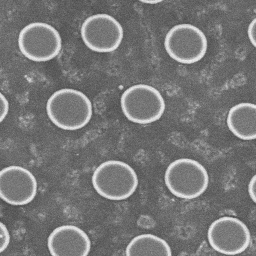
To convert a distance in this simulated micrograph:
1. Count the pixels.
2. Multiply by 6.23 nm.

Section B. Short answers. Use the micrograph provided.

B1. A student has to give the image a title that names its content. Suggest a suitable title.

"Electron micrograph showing a regular array of raised bodies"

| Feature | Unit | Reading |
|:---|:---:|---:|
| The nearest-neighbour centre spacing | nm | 444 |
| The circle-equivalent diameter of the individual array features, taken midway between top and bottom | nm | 240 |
